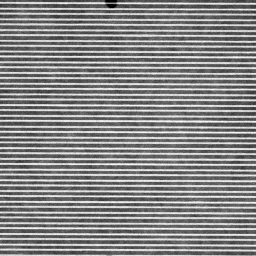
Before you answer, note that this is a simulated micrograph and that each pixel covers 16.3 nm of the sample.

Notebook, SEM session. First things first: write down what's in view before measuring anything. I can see parallel lines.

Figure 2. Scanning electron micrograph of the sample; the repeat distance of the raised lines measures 87.3 nanometers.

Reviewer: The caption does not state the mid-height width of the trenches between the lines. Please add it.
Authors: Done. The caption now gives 0.0692 micrometres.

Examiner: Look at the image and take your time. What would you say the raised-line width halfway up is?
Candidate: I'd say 0.0163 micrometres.